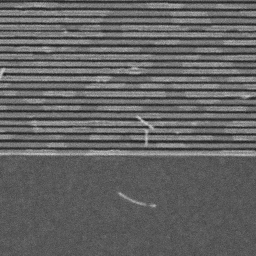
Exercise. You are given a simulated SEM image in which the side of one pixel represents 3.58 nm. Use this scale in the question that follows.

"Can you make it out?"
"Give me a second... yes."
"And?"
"parallel lines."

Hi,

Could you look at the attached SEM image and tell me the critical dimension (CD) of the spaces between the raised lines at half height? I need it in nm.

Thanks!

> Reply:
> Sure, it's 10.3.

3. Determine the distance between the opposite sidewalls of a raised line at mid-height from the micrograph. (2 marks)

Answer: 0.0139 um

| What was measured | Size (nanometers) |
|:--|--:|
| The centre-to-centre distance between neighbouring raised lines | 26.3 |